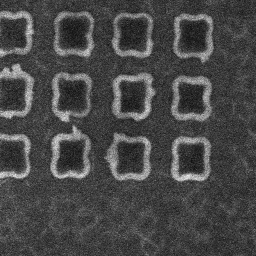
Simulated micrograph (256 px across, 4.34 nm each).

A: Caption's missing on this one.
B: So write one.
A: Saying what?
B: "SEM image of a regular array of raised bodies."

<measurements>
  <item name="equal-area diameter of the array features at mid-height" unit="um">0.187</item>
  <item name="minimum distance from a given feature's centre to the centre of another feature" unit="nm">254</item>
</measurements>